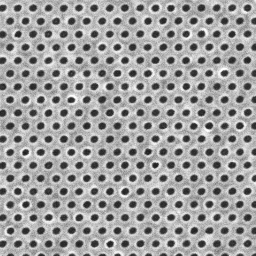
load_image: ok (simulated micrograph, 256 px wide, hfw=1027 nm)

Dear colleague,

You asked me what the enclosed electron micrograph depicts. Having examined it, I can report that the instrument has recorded a regular array of holes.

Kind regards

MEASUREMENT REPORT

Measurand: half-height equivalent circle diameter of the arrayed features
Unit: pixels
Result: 7.91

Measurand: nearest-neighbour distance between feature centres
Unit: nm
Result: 59.8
